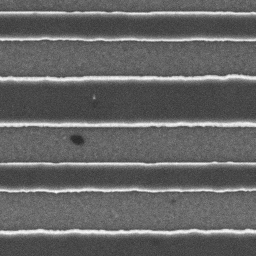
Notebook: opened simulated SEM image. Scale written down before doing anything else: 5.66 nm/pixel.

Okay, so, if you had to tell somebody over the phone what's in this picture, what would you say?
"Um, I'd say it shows lines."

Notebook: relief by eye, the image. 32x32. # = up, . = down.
................................
................................
################################
################################
################################
................................
................................
................................
................................
............................###.
################################
################################
################################
################################
################################
################################
................................
................................
................................
................................
.#################.#############
################################
################################
################################
................................
................................
................................
................................
................................
################################
################################
################################